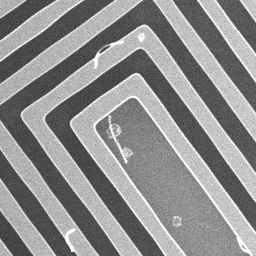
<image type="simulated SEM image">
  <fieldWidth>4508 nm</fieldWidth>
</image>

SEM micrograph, groups of lines, slits or small figures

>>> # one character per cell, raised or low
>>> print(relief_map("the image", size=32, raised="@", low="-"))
@@@---@@@@----@@@---@@---@@---@@
@----@@@----@@@@----@@@---@@---@
---@@@@----@@@@------@@---@@@---
--@@@@----@@@----@@---@@---@@@--
-@@@@---@@@@----@@@@--@@@---@@--
@@@----@@@@---@@@@@@---@@@---@@-
@@---@@@@----@@@@-@@@---@@---@@@
----@@@@---@@@@----@@@---@@---@@
---@@@@---@@@@------@@---@@@---@
-@@@@----@@@----@@---@@---@@---@
@@@@----@@@----@@@---@@@---@@---
@@----@@@@---@@@@@@---@@@--@@@--
@----@@@----@@@@-@@@---@@---@@@-
---@@@@----@@@@---@@@---@@---@@-
---@@@---@@@@------@@---@@@---@@
---@@@---@@@--------@@---@@---@@
@---@@@--@@@--------@@@---@@---@
@@---@@---@@@--------@@---@@@---
@@@--@@@---@@@--------@@---@@@--
-@@---@@@--@@@--------@@@---@@--
-@@@---@@@--@@@--------@@@---@@-
--@@@--@@@---@@@--------@@---@@@
---@@---@@@---@@---------@@---@@
@---@@---@@@--@@@--------@@@---@
@@--@@@---@@---@@@--------@@@--@
@@---@@@--@@@---@@@--------@@---
@@@---@@---@@@---@@---------@@--
-@@@--@@@---@@---@@@--------@@@-
--@@---@@@---@@---@@@--------@@@
--@@@---@@@--@@@---@@---------@@
---@@@---@@---@@@---@@--------@@
@---@@@--@@@---@@---@@@--------@